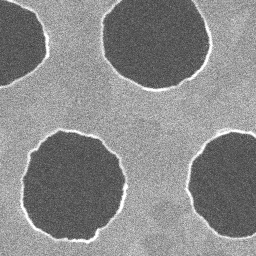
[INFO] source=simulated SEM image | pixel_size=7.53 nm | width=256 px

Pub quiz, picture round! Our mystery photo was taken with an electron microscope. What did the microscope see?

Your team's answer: holes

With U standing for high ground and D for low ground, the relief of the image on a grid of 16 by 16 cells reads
DDUUUUUDDDDDUUUD
DDDUUUDDDDDDDUUU
DDDUUUDDDDDDDUUU
DDDUUUUDDDDDDUUU
DDUUUUUDDDDDUUUU
UUUUUUUUUDDUUUUU
UUUUUUUUUUUUUUUU
UUUUUUDUUUUUUUUU
UUUDDDUUUUUUUDDD
UUDDDDDUUUUUDDDD
UUDDDDDDUUUUDDDD
UDDDDDDDUUUUDDDD
UDDDDDDDUUUUDDDD
UUDDDDDUUUUUUDDD
UUUDDDUUUUUUUDDD
UUUUUUUUUUUUUUUU